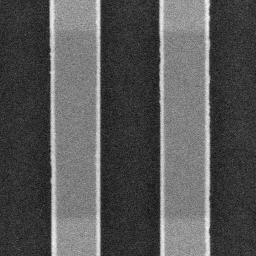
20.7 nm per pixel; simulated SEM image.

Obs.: lines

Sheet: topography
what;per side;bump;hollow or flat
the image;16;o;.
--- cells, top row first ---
...ooo....ooo...
...ooo....ooo...
...ooo....ooo...
...ooo....ooo...
...ooo....ooo...
...ooo....ooo...
...ooo....ooo...
...ooo....ooo...
...ooo....ooo...
...ooo....ooo...
...ooo....ooo...
...ooo....ooo...
...ooo....ooo...
...ooo....ooo...
...ooo....ooo...
...ooo....ooo...